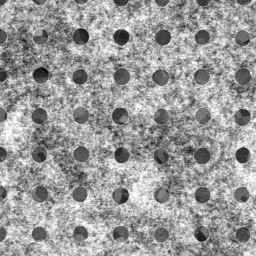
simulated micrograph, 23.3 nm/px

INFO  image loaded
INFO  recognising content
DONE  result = a regular array of raised bodies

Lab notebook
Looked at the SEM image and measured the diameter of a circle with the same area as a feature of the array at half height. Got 390 nm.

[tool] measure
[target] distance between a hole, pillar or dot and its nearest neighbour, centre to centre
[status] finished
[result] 906 nm